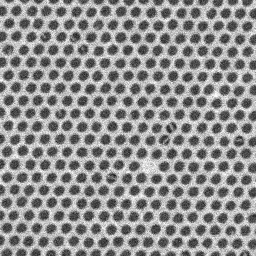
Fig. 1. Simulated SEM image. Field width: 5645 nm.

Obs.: a regular array of holes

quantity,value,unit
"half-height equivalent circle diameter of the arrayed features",246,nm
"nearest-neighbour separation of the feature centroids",313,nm